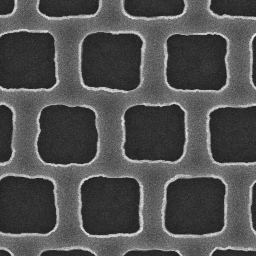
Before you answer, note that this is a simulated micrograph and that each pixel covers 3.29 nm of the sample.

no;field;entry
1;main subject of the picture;holes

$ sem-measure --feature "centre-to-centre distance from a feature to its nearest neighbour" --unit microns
0.272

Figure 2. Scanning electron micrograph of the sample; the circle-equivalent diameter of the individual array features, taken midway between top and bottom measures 209 nanometres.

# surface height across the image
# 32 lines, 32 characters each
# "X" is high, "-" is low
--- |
--XXX-------XXXX-------XXX------
-XXXX-------XXXX-------XXXX-----
XXXXXXXXXXXXXXXXXXXXXXXXXXXXXXXX
XXXXXXXXXXXXXXXXXXXXXXXXXXXXXXXX
-------XXXX------XXXX-------XXXX
-------XXX--------XXX-------XXX-
-------XXX--------XXX-------XXX-
-------XXX--------XXX-------XXX-
-------XXX--------XXX-------XXX-
-------XXX--------XXX-------XXX-
-------XXXX------XXXX-------XXXX
XXXXXXXXXXXXXXXXXXXXXXXXXXXXXXXX
XXXXXXXXXXXXXXXXXXXXXXXXXXXXXXXX
-XXXXX-----XXXXX-------XXXXX----
--XXX-------XXXX-------XXX------
--XXX-------XXXX-------XXX------
--XXX-------XXXX-------XXX------
-XXXX-------XXXX-------XXX------
-XXXX-------XXX--------XXX------
-XXXX-------XXXX-------XXXX-----
XXXXXXX-XXXXXXXXXXXXXXXXXXXXXXXX
XXXXXXXXXXXXXXXXXXXXXXXXXXXXXXXX
------XXXXX------XXXXX-----XXXXX
-------XXX-------XXXX-------XXXX
-------XXX--------XXX-------XXX-
-------XXX-------XXXX-------XXX-
-------XXX-------XXXX-------XXX-
-------XXX-------XXXX-------XXXX
-------XXXX------XXXX-------XXXX
XXXXXXXXXXXXXXXXXXXXXXXXXXXXXXXX
XXXXXXXXXXXXXXXXXXXXXXXXXXXXXXXX
-XXXX------XXXXX------XXXXX-----